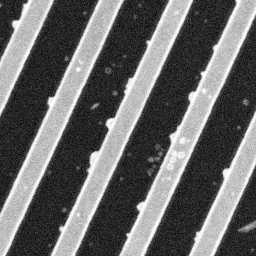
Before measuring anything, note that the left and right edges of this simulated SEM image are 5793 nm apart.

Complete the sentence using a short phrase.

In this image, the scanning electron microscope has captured lines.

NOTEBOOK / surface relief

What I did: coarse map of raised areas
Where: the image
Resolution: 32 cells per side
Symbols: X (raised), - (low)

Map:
---XXX------XXX------XXX------XX
---XXX------XXX-----XXX------XXX
--XXXX-----XXX------XXX------XXX
--XXX------XXX------XXX-----XXX-
--XXX-----XXX------XXX------XXX-
-XXX------XXX------XXX-----XXX--
-XXX-----XXX------XXX------XXX--
XXX------XXX------XXX-----XXX---
XXX-----XXX------XXX------XXX---
XX------XXX------XXX-----XXX----
XX------XXX-----XXX------XXX----
X------XXX------XXX-----XXX-----
X------XXX-----XXX------XXX-----
------XXX------XXX------XXX-----
------XXX------XX------XXX------
-----XXX------XXX------XXX-----X
-----XXX------XX------XXX------X
----XXX------XXX------XXX-----XX
----XXX------XX------XXX------XX
---XXX------XXX------XXX-----XXX
---XXX------XXX-----XXX------XXX
---XXX-----XXX------XXX-----XXX-
--XXX------XXX-----XXX------XXX-
--XXX-----XXX------XXX------XXX-
-XXX------XXX-----XXX------XXX--
-XXX-----XXX------XXX------XXX--
XXX------XXX-----XXX------XXX---
XXX-----XXX------XXX------XXX---
XX------XXX------XXX-----XXX----
XX------XX------XXX------XXX----
X------XXX------XXX-----XXX-----
X------XXX-----XXX------XXX-----